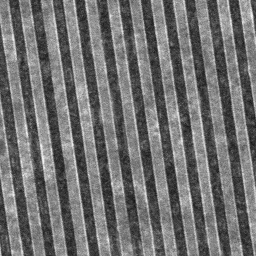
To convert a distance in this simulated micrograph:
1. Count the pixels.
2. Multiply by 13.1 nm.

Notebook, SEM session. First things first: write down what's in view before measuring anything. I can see parallel lines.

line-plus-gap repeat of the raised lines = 285 nanometres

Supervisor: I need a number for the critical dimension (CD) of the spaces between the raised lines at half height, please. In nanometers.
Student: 146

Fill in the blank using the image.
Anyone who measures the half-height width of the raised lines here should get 135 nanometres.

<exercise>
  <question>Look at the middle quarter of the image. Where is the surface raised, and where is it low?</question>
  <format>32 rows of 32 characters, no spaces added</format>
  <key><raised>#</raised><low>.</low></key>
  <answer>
..###...##...###...##...###...##
...##...##....##...##....##...##
...##...###...##...###...##...##
...##...###...##...###...##...##
...##...###...##...###...##...##
...###...##...###..###...###..##
...###...##...###...##...###...#
...###...##...###...##...###...#
...###...##....##...##....##...#
#...##...###...##...###...##...#
#...##...###...##...###...##...#
#...##...###...##...###...##...#
#...###...##...###...##...###..#
#...###...##...###...##...###...
#...###...##...###...##...###...
#....##...##....##...##....##...
##...##...###...##...###...##...
##...##...###...##...###...##...
##...##...###...##...###...##...
##...###...##...###...##...###..
##...###...##...###...##...###..
##...###...##...###...##...###..
##....##...###...##...##....##..
###...##...###...##...###...##..
###...##...###...##...###...##..
###...##...###...##...###...##..
.##...###...##...###...##...###.
.##...###...##...###...##...###.
.##...###...##...###...##...###.
.##....##...##....##...##....##.
.###...##...###...##...###...##.
.###...##...###...##...###...##.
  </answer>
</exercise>